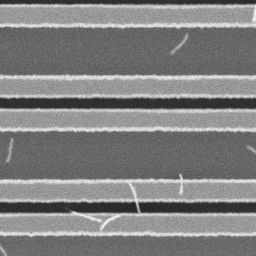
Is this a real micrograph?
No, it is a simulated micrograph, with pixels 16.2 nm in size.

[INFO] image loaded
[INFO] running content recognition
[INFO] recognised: lines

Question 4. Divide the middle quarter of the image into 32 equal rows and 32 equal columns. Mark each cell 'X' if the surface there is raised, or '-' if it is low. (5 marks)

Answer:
--------------------------------
--------------------------------
--------------------------------
XXXXXXXXXXXXXXXXXXXXXXXXXXXXXXXX
XXXXXXXXXXXXXXXXXXXXXXXXXXXXXXXX
XXXXXXXXXXXXXXXXXXXXXXXXXXXXXXXX
XXXXXXXXXXXXXXXXXXXXXXXXXXXXXXXX
XXXXXXXXXXXXXXXXXXXXXXXXXXXXXXXX
-----X-------XX-XX---XXXX-X-X---
--------------------------------
--------------------------------
XXXXXXXXXXXXXXXXXXXXXXXXXXXXXXXX
XXXXXXXXXXXXXXXXXXXXXXXXXXXXXXXX
XXXXXXXXXXXXXXXXXXXXXXXXXXXXXXXX
XXXXXXXXXXXXXXXXXXXXXXXXXXXXXXXX
XXXXXXXXXXXXXXXXXXXXXXXXXXXXXXXX
XXXXXXXXXXXXXXXXXXXXXXXXXXXXXXXX
--------------------------------
--------------------------------
--------------------------------
--------------------------------
--------------------------------
--------------------------------
--------------------------------
--------------------------------
--------------------------------
--------------------------------
--------------------------------
--------------------------------
XXXXXXXXXXXXXXXXXXXXXXXXXXXXXXXX
XXXXXXXXXXXXXXXXXXXXXXXXXXXXXXXX
XXXXXXXXXXXXXXXXXXXXXXXXXXXXXXXX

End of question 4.